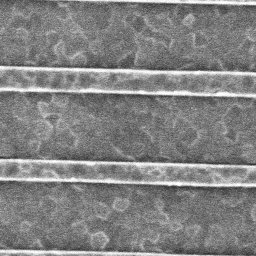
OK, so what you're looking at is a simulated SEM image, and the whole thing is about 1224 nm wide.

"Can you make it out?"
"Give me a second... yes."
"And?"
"one or a few lines or trenches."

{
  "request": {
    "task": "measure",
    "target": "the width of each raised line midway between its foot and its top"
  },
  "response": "101 nanometres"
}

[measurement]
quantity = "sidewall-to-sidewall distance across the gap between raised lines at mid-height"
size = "334 nm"